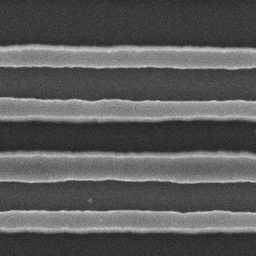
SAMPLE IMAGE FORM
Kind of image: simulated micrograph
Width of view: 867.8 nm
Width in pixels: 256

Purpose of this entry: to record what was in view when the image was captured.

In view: lines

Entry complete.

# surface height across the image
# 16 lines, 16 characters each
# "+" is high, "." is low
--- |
................
................
................
++++++++++++++++
++++++++++++++++
++++++++++++++++
++++++++++++++++
................
................
................
++++++++++++++++
++++++++++++++++
++++++++++++++++
++++++++++++++++
................
................